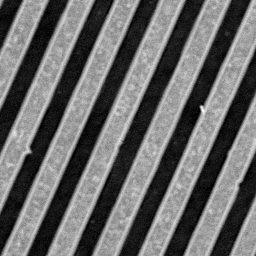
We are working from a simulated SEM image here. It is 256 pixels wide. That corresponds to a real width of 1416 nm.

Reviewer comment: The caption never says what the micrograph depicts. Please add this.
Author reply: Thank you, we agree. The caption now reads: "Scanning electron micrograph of parallel lines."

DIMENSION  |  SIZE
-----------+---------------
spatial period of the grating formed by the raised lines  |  230 nm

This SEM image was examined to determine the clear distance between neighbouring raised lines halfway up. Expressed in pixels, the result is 20.3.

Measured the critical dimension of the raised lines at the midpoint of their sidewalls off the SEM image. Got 118 nm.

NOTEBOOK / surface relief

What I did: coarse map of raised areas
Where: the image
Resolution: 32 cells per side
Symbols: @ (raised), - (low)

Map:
---@@@---@@---@@@---@@@---@@@--@
--@@@---@@@---@@@---@@---@@@---@
--@@@---@@@--@@@---@@@---@@@--@@
-@@@---@@@---@@@---@@@--@@@---@@
-@@@---@@@--@@@---@@@---@@@---@@
-@@@--@@@---@@@---@@@--@@@---@@@
@@@---@@@---@@---@@@---@@@---@@@
@@@--@@@---@@@---@@@---@@---@@@-
@@---@@@---@@@--@@@---@@@---@@@-
@@---@@---@@@---@@@---@@@--@@@--
@---@@@---@@@---@@---@@@---@@@--
@---@@@--@@@---@@@---@@@--@@@---
---@@@---@@@---@@@--@@@---@@@---
---@@@---@@---@@@---@@@--@@@---@
--@@@---@@@---@@@--@@@---@@@---@
--@@@---@@@--@@@---@@@---@@@--@@
-@@@---@@@---@@@---@@---@@@---@@
-@@@---@@@--@@@---@@@---@@@--@@@
@@@@--@@@---@@@---@@@--@@@---@@@
@@@---@@@--@@@---@@@---@@@---@@@
@@@--@@@---@@@---@@@--@@@---@@@-
@@---@@@---@@@--@@@---@@@---@@@-
@@---@@---@@@---@@@---@@---@@@--
@---@@@---@@@--@@@---@@@---@@@--
@---@@@--@@@---@@@---@@@--@@@---
---@@@---@@@--@@@---@@@---@@@---
---@@@--@@@---@@@---@@@---@@---@
--@@@---@@@---@@---@@@---@@@---@
--@@@--@@@---@@@---@@@---@@@--@@
-@@@---@@@---@@@--@@@---@@@---@@
-@@@---@@@--@@@---@@@---@@@--@@@
-@@---@@@---@@@---@@---@@@---@@@